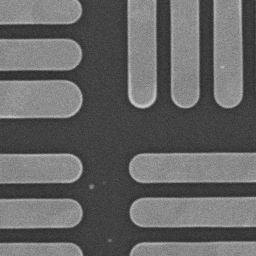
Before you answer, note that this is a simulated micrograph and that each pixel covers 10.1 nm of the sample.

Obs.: groups of lines, slits or small figures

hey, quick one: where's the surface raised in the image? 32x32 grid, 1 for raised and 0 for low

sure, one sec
11111111110000001110011110011100
11111111110000001110011110011100
11111111110000001110011110011100
00000000000000001110011110011100
00000000000000001110011110011100
11111111110000001110011110011100
11111111110000001110011110011100
11111111110000001110011110011100
11111111100000001110011110011100
00000000000000001110011110011100
11111111100000001110011110011100
11111111110000001110011110011100
11111111110000001110001110011100
11111111110000000000000000000000
11111111100000000000000000000000
00000000000000000000000000000000
00000000000000000000000000000000
00000000000000000000000000000000
00000000000000000000000000000000
11111111100000000111111111111111
11111111110000001111111111111111
11111111110000001111111111111111
11111111100000000111111111111111
00000000000000000000000000000000
00000000000000000000000000000000
11111111110000000111111111111111
11111111110000001111111111111111
11111111110000000111111111111111
11100000000000000000000000000000
00000000000000000000000000000000
01111111100000000011111111111111
11111111110000001111111111111111